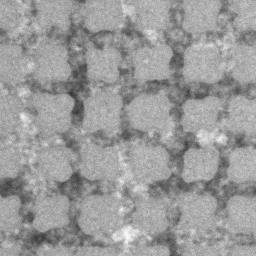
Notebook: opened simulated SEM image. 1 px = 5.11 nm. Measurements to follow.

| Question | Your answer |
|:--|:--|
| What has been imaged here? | a regular array of raised bodies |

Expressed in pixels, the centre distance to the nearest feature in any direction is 48.4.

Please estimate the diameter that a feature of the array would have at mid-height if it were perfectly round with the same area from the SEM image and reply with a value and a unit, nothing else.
191 nm